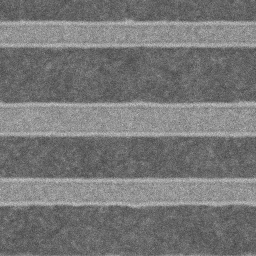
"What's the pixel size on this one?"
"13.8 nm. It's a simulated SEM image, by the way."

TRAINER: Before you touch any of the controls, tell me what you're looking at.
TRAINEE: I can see one or a few lines or trenches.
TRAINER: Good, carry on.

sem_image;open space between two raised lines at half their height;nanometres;718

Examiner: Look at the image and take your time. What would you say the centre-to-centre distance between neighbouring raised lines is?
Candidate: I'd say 78.9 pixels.